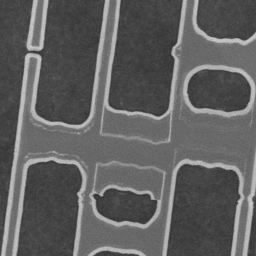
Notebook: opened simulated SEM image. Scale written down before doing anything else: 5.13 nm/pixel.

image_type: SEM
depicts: one or a few lines or trenches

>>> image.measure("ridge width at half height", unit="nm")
64.9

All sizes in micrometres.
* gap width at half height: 0.31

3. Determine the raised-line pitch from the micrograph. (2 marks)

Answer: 388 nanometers